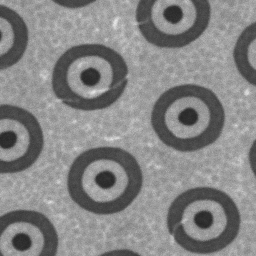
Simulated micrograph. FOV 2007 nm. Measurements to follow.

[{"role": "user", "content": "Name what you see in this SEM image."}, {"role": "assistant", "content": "ring-shaped grooves with a dot in the middle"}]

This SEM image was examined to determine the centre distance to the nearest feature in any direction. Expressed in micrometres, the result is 0.812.